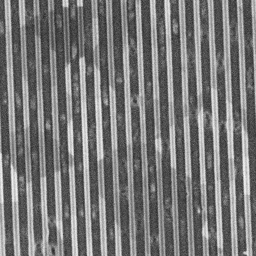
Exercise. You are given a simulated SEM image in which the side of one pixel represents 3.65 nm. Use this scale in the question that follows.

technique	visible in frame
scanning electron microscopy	parallel lines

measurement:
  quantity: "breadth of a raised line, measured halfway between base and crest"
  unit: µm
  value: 0.0169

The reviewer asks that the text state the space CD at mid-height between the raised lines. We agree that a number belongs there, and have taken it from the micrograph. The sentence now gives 37.4 nanometres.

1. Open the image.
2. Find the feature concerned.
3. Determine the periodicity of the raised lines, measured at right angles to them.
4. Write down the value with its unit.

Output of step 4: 52.9 nanometres